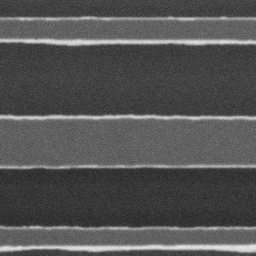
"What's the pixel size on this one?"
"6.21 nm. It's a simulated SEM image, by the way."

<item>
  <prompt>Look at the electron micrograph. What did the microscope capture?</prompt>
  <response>lines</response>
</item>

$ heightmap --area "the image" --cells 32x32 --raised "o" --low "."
................................
................................
oooooooooooooooooooooooooooooooo
oooooooooooooooooooooooooooooooo
oooooooooooooooooooooooooooooooo
................................
................................
................................
................................
................................
................................
................................
................................
................................
................................
oooooooooooooooooooooooooooooooo
oooooooooooooooooooooooooooooooo
oooooooooooooooooooooooooooooooo
oooooooooooooooooooooooooooooooo
oooooooooooooooooooooooooooooooo
oooooooooooooooooooooooooooooooo
................................
................................
................................
................................
................................
................................
................................
oooooooooo..oooo.ooooo..oooooooo
oooooooooooooooooooooooooooooooo
oooooooooooooooooooooooooooooooo
................................